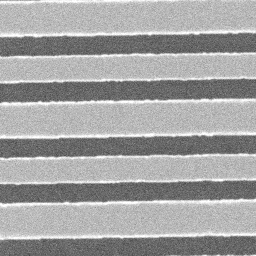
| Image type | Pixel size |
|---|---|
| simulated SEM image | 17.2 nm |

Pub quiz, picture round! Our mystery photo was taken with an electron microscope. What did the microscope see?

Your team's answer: lines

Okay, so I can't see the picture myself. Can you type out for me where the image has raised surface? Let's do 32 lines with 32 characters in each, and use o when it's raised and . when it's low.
oooooooooooooooooooooooooooooooo
oooooooooooooooooooooooooooooooo
oooooooooooooooooooooooooooooooo
oooooooooooooooooooooooooooooooo
....o...........................
................................
................................
oooooooooooooooooooooooooooooooo
oooooooooooooooooooooooooooooooo
oooooooooooooooooooooooooooooooo
................................
................................
.........................o.ooooo
oooooooooooooooooooooooooooooooo
oooooooooooooooooooooooooooooooo
oooooooooooooooooooooooooooooooo
oooooooooooooooooooooooooooooooo
................................
................................
..................oooooooooooooo
oooooooooooooooooooooooooooooooo
oooooooooooooooooooooooooooooooo
oooooooooooooooooooooooooooo....
................................
................................
..oooooooooooooooooooooooooooooo
oooooooooooooooooooooooooooooooo
oooooooooooooooooooooooooooooooo
oooooooooooooooooooooooooooooooo
oooooooooooooooooooo............
................................
................................